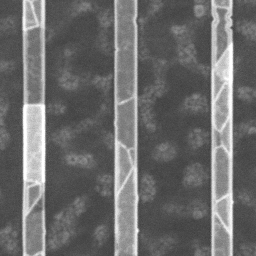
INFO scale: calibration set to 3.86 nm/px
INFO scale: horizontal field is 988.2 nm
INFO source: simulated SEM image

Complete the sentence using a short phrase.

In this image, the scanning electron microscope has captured one or a few lines or trenches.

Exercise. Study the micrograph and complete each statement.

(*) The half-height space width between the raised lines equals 276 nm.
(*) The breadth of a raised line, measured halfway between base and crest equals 78.6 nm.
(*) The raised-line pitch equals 362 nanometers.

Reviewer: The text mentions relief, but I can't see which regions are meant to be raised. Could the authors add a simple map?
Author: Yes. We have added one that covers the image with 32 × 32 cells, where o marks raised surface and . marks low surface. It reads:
...ooo........ooo..........oo...
...ooo........ooo..........oo...
...ooo........ooo..........oo...
...ooo........ooo..........oo...
...oo.........ooo..........oo...
...oo.........ooo..........oo...
...ooo........ooo..........oo...
...ooo........ooo..........oo...
...ooo........ooo..........oo...
...ooo........ooo..........oo...
...ooo........ooo..........oo...
...oo.........ooo..........oo...
...oo.........ooo..........oo...
...oo.........ooo..........oo...
...oo.........ooo..........oo...
...oo.........ooo..........oo...
...oo.........ooo..........oo...
...oo.........ooo..........oo...
...oo.........ooo..........oo...
...oo.........ooo..........oo...
...oo.........ooo..........oo...
...oo.........ooo..........oo...
...oo.........ooo..........oo...
...oo.........ooo..........oo...
...oo.........ooo..........oo...
...oo.........ooo..........oo...
...oo.........ooo..........oo...
...oo.........ooo..........oo...
...ooo........ooo..........oo...
...ooo........ooo..........oo...
...ooo........ooo..........oo...
...ooo........ooo..........oo...